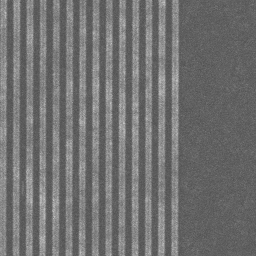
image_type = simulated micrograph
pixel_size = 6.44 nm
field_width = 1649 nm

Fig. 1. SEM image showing parallel lines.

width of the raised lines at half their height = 0.0314 um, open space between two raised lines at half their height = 8.62 pixels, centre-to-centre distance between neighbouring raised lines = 85.1 nanometres